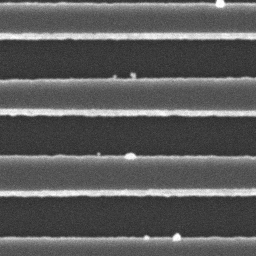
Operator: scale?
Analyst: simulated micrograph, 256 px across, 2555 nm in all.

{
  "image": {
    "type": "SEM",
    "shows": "lines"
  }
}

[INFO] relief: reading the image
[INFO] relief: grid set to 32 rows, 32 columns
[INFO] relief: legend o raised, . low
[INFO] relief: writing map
oooooo.ooooo......o......o.oo...
oooooooooooooooooooooooooooooooo
oooooooooooooooooooooooooooooooo
oooooooooooooooooooooooooooooooo
oooooooooooooooooooooooooooooooo
................................
................................
................................
................................
................................
oooooooooooooooooooooooooooooooo
oooooooooooooooooooooooooooooooo
oooooooooooooooooooooooooooooooo
oooooooooooooooooooooooooooooooo
................................
................................
................................
................................
................................
...............oo...............
oooooooooooooooooooooooooooooooo
oooooooooooooooooooooooooooooooo
oooooooooooooooooooooooooooooooo
oooooooooooooooooooooooooooooooo
..oo.o.o............o...........
................................
................................
................................
................................
......................o.........
oooooooooooooooooooooooooooooooo
oooooooooooooooooooooooooooooooo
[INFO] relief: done